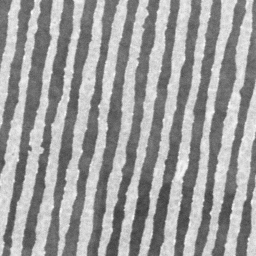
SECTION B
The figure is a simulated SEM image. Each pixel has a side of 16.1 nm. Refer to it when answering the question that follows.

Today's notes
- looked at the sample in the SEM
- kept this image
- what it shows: parallel lines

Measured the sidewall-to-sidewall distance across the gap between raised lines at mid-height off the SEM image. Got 198 nm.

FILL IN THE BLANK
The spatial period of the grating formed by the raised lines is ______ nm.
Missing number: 339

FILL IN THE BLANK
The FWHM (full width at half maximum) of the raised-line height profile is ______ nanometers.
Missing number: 139